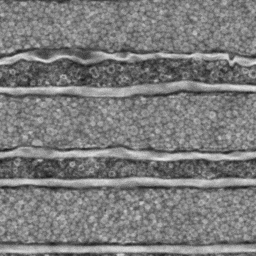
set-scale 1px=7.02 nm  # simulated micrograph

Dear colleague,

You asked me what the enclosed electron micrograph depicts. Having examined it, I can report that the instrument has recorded one or a few lines or trenches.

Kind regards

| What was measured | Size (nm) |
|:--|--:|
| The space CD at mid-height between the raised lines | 468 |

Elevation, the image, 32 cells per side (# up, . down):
................................
................................
................................
................................
................................
................................
................................
.#############################..
################################
################################
################################
..............#.................
................................
................................
................................
................................
................................
................................
................................
###################.....#.....##
################################
################################
################################
................................
................................
................................
................................
................................
................................
................................
................................
################################